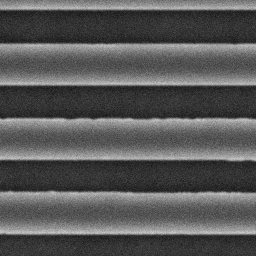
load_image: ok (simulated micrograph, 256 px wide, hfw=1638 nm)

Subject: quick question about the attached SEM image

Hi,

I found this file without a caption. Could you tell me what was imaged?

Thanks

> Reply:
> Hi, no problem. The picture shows lines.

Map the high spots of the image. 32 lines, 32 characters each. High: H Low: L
HHHHHHHHHHHHHHHHHHHHHHHHHHHHHHHH
LLLLLLLLLLLLLLLLLLLLLLLLLLLLLLLL
LLLLLLLLLLLLLLLLLLLLLLLLLLLLLLLL
LLLLLLLLLLLLLLLLLLLLLLLLLLLLLLLL
LLLLLLLLLLLLLLLLLLLLLLLLLLLLLLLL
LLLLLLLLLLLLLLLLLLLLLLLLLLLLLLLL
HHHHHHHHHHHHHHHHHHHHHHHHHHHHHHHH
HHHHHHHHHHHHHHHHHHHHHHHHHHHHHHHH
HHHHHHHHHHHHHHHHHHHHHHHHHHHHHHHH
HHHHHHHHHHHHHHHHHHHHHHHHHHHHHHHH
HHHHHHHHHHHHHHHHHHHHHHHHHHHHHHHH
LLLLLLLLLLLLLLLLLLLLLLLLLLLLLLLL
LLLLLLLLLLLLLLLLLLLLLLLLLLLLLLLL
LLLLLLLLLLLLLLLLLLLLLLLLLLLLLLLL
LLLLLLLLLLLLLLLLLLLLLLLLLLLLLLLL
HHHHHHHHHHHHHHHHHHHHHHHHHHHHHHHH
HHHHHHHHHHHHHHHHHHHHHHHHHHHHHHHH
HHHHHHHHHHHHHHHHHHHHHHHHHHHHHHHH
HHHHHHHHHHHHHHHHHHHHHHHHHHHHHHHH
HHHHHHHHHHHHHHHHHHHHHHHHHHHHHHHH
LLLLLLLLLLLLLLLLLLLLLLLLLLLLLLLL
LLLLLLLLLLLLLLLLLLLLLLLLLLLLLLLL
LLLLLLLLLLLLLLLLLLLLLLLLLLLLLLLL
LLLLLLLLLLLLLLLLLLLLLLLLLLLLLLLL
HHHHHHHHHHHHHHHHHHHHHHHHHHHHHHHH
HHHHHHHHHHHHHHHHHHHHHHHHHHHHHHHH
HHHHHHHHHHHHHHHHHHHHHHHHHHHHHHHH
HHHHHHHHHHHHHHHHHHHHHHHHHHHHHHHH
HHHHHHHHHHHHHHHHHHHHHHHHHHHHHHHH
LLLLLLLLLLLLLLLLLLLLLLLLLLLLLLLL
LLLLLLLLLLLLLLLLLLLLLLLLLLLLLLLL
LLLLLLLLLLLLLLLLLLLLLLLLLLLLLLLL